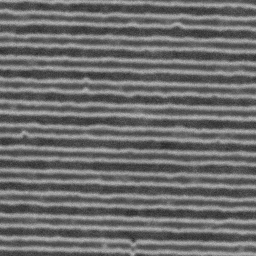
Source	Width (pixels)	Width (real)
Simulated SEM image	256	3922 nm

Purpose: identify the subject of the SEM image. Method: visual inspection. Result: parallel lines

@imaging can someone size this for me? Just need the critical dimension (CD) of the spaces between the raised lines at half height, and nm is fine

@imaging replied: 184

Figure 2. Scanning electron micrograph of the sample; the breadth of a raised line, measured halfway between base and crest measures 11.1 pixels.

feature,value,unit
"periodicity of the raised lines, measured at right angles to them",346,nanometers